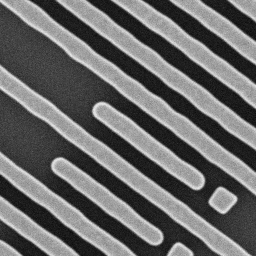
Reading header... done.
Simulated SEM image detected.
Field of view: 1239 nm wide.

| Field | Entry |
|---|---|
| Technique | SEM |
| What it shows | groups of lines, slits or small figures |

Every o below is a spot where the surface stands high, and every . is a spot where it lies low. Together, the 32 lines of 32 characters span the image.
oooo....ooo....ooo....oooo...ooo
..oooo...oooo...oooo...oooo...oo
...oooo...oooo...oooo....oooo...
....oooo...oooo....oooo...oooo..
......ooo....oooo...oooo...oooo.
.......oooo...oooo...oooo....ooo
........oooo...oooo....oooo...oo
..........ooo....oooo...oooo...o
...........oooo...oooo...oooo...
oo..........oooo....ooo....oooo.
ooo...........oooo...oooo...oooo
.ooo...........oooo...oooo...ooo
..oooo..........oooo....ooo....o
...oooo.....oo....ooo....oooo...
.....ooo....oooo...oooo...oooo..
......oooo...oooo...oooo...oooo.
.......oooo...oooo....ooo....ooo
........oooo....oooo...oooo...oo
..........oooo...oooo...oooo....
o..........oooo...oooo...oooo...
oo....ooo...oooo....ooo....oooo.
ooo....ooo....ooo....oooo...oooo
.oooo...oooo...oooo...oooo....oo
..oooo...oooo...oooo....o..o...o
....ooo....ooo....oooo....ooo...
o....oooo...oooo...oooo...ooo...
ooo...oooo...oooo....ooo...o....
oooo...oooo....ooo....oooo......
..ooo....oooo...oooo...oooo.....
...oooo...oooo...ooo.....ooo....
o...oooo....ooo....o..o...oooo..
oo....ooo....ooo.....ooo...oooo.